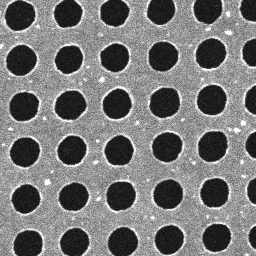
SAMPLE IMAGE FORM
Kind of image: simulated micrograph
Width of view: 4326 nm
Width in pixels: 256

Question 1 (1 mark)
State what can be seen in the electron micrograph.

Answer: a regular array of holes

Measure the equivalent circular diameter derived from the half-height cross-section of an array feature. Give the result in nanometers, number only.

512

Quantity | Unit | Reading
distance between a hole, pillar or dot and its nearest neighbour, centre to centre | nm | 774